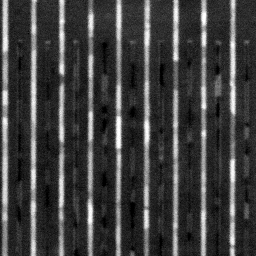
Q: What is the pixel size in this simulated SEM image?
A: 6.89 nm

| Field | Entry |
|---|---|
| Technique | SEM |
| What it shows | parallel lines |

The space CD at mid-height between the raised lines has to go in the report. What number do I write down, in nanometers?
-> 72.3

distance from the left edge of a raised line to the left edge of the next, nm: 97.9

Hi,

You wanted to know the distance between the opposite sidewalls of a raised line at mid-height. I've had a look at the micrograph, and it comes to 0.0241 micrometres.